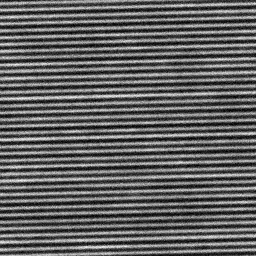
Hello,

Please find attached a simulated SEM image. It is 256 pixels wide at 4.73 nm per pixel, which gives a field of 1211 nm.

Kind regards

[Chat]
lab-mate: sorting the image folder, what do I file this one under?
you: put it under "parallel lines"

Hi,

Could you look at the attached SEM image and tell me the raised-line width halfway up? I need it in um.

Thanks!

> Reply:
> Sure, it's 0.0089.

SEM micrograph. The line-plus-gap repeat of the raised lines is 0.0323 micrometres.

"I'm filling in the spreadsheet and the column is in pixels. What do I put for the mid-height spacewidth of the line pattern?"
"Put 4.5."